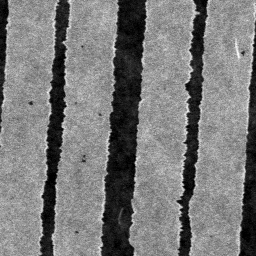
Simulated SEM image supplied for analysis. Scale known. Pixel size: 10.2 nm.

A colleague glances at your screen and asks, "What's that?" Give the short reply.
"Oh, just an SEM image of one or a few lines or trenches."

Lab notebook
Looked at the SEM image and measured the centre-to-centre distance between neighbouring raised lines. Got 0.692 um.